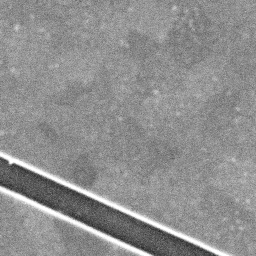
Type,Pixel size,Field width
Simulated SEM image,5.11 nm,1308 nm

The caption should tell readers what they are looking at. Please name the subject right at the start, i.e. one or a few lines or trenches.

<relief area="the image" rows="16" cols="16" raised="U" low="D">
UUUUUUUUUUUUUUUU
UUUUUUUUUUUUUUUU
UUUUUUUUUUUUUUUU
UUUUUUUUUUUUUUUU
UUUUUUUUUUUUUUUU
UUUUUUUUUUUUUUUU
UUUUUUUUUUUUUUUU
UUUUUUUUUUUUUUUU
UUUUUUUUUUUUUUUU
UUUUUUUUUUUUUUUU
DDUUUUUUUUUUUUUU
DDDDUUUUUUUUUUUU
UUDDDDUUUUUUUUUU
UUUUDDDDDUUUUUUU
UUUUUUDDDDDUUUUU
UUUUUUUUDDDDDUUU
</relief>